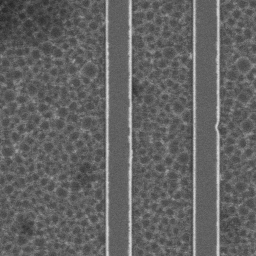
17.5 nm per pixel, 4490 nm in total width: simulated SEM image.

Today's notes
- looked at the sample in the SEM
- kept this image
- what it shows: one or a few lines or trenches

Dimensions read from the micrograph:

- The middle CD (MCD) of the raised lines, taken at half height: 0.412 micrometres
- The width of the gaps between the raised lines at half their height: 1110 nm